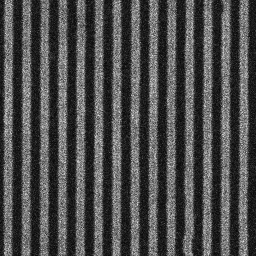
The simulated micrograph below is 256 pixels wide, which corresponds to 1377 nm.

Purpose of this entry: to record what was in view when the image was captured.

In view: parallel lines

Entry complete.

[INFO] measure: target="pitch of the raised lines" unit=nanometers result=97.4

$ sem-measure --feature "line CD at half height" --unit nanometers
43.7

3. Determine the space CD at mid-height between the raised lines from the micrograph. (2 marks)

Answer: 53.8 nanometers